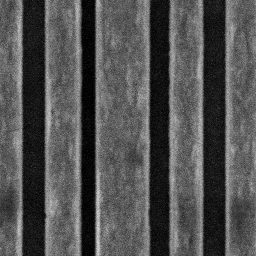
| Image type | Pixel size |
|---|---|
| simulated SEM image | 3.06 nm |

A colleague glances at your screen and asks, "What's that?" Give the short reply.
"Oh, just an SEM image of one or a few lines or trenches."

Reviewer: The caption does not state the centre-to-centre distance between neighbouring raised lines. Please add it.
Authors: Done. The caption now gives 61.6 px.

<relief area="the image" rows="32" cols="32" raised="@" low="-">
@@@---@@@@--@@@@@@@--@@@@---@@@@
@@@---@@@@--@@@@@@@--@@@@---@@@@
@@@---@@@@--@@@@@@@--@@@@---@@@@
@@@---@@@@--@@@@@@@--@@@@---@@@@
@@@---@@@@--@@@@@@@--@@@@---@@@@
@@@---@@@@--@@@@@@@--@@@@---@@@@
@@@---@@@@--@@@@@@@--@@@@---@@@@
@@@---@@@@--@@@@@@@--@@@@---@@@@
@@@---@@@@--@@@@@@@--@@@@---@@@@
@@@---@@@@--@@@@@@@--@@@@---@@@@
@@@---@@@@--@@@@@@@--@@@@---@@@@
@@@---@@@@--@@@@@@@--@@@@---@@@@
@@@---@@@@--@@@@@@@--@@@@---@@@@
@@@---@@@@--@@@@@@@--@@@@---@@@@
@@@---@@@@--@@@@@@@--@@@@---@@@@
@@@---@@@@--@@@@@@@--@@@@---@@@@
@@@---@@@@--@@@@@@@--@@@@---@@@@
@@@---@@@@--@@@@@@@--@@@@---@@@@
@@@---@@@@--@@@@@@@--@@@@---@@@@
@@@---@@@@--@@@@@@@--@@@@---@@@@
@@@---@@@@--@@@@@@@--@@@@---@@@@
@@@---@@@@--@@@@@@@--@@@@---@@@@
@@@---@@@@--@@@@@@@--@@@@---@@@@
@@@---@@@@--@@@@@@---@@@@---@@@@
@@@---@@@@--@@@@@@@--@@@@---@@@@
@@@---@@@@--@@@@@@@--@@@@---@@@@
@@@---@@@@--@@@@@@@--@@@@---@@@@
@@@---@@@@--@@@@@@@--@@@@---@@@@
@@@---@@@@--@@@@@@@--@@@@---@@@@
@@@---@@@@--@@@@@@@--@@@@---@@@@
@@@---@@@@--@@@@@@@--@@@@---@@@@
@@@---@@@@--@@@@@@@--@@@@---@@@@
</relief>